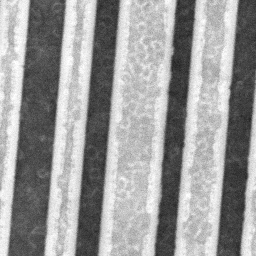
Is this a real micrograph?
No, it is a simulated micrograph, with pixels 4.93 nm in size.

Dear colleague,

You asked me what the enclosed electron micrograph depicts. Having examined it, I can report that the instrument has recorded one or a few lines or trenches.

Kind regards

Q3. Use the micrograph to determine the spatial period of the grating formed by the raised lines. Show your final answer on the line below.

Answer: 332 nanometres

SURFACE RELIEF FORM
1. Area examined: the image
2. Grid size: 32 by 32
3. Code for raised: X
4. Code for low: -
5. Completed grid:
XXX------XXX---XXXXXXX---XXXX---
XXX------XXX---XXXXXX----XXXX---
XXX------XX----XXXXXX----XXXX---
XXX------XX----XXXXXX----XXXX---
XXX-----XXX----XXXXXX----XXXX---
XXX-----XXX----XXXXXX---XXXXX---
XXX-----XXX----XXXXXX---XXXXX---
XXX-----XXX----XXXXXX---XXXXX---
XX------XXX----XXXXXX---XXXXX---
XX------XXX----XXXXXX---XXXX----
XX------XXX----XXXXXX---XXXX----
XX------XXX----XXXXX----XXXX----
XX------XX----XXXXXX----XXXX----
XX------XX----XXXXXX----XXXX----
XX-----XXX----XXXXXX----XXXX----
XX-----XXX----XXXXXX----XXXX----
XX-----XXX----XXXXXX----XXXX----
XX-----XXX----XXXXXX----XXXX----
XX-----XXX----XXXXXX---XXXXX----
XX-----XXX----XXXXXX---XXXXX----
X------XXX----XXXXXX---XXXXX----
X------XXX----XXXXXX---XXXXX---X
X------XXX----XXXXXX---XXXX----X
X------XXX----XXXXXX---XXXX----X
X------XXX---XXXXXX----XXXX----X
X------XX----XXXXXX----XXXX----X
X------XX----XXXXXX----XXXX----X
X-----XXX----XXXXXX----XXXX----X
X-----XXX----XXXXXX---XXXXX----X
X-----XXX----XXXXXX---XXXXX----X
X-----XXX----XXXXXX---XXXXX----X
------XXX----XXXXXX---XXXXX----X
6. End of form